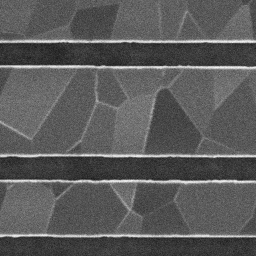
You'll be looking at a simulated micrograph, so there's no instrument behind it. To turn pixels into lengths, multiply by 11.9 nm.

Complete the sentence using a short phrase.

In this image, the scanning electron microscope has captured lines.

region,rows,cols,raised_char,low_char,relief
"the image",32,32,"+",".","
++++++++++++++++++++++++++++++++
++++++++++++++++++++++++++++++++
++++++++++++++++++++++++++++++++
++++++++++++++++++++++++++++++++
++++++++++++++++++++++++++++++++
................................
................................
................................
++++++++++++++++++++++++++++++++
++++++++++++++++++++++++++++++++
++++++++++++++++++++++++++++++++
++++++++++++++++++++++++++++++++
++++++++++++++++++++++++++++++++
++++++++++++++++++++++++++++++++
++++++++++++++++++++++++++++++++
++++++++++++++++++++++++++++++++
++++++++++++++++++++++++++++++++
++++++++++++++++++++++++++++++++
++++++++++++++++++++++++++++++++
+.+++........+++++++++++++++++++
................................
................................
................................
++++++++++++++++++++++++++++++++
++++++++++++++++++++++++++++++++
++++++++++++++++++++++++++++++++
++++++++++++++++++++++++++++++++
++++++++++++++++++++++++++++++++
++++++++++++++++++++++++++++++++
.......+.++++...++++++++++++++++
................................
................................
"